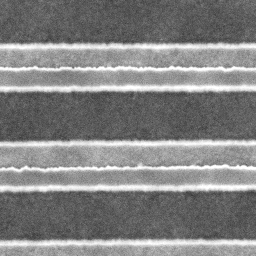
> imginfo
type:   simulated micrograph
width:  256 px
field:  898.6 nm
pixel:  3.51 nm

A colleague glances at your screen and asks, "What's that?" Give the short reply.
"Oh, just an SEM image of lines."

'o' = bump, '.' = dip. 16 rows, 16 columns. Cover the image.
................
................
................
oooooooooooooooo
oooooooooooooooo
oooooooooooooooo
................
................
................
oooooooooooooooo
oooooooooooooooo
oooooooooooooooo
................
................
................
oooooooooooooooo